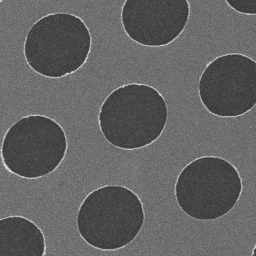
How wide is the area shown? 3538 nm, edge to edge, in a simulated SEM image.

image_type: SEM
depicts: holes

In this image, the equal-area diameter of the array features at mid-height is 888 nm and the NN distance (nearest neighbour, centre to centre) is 1430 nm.